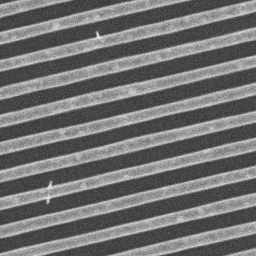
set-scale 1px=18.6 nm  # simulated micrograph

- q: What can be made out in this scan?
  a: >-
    parallel lines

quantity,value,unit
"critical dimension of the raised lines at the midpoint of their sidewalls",202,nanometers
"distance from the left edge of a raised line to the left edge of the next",501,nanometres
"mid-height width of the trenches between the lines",0.301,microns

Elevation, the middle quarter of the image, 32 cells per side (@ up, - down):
-------@@@@@@@@@@@@-------------
---@@@@@@@@@@@@@----------------
@@@@@@@@@@-------------------@@@
@@@@@@------------------@@@@@@@@
@@@-----------------@@@@@@@@@@@@
---------------@@@@@@@@@@@@-----
-----------@@@@@@@@@@@@@--------
------@@@@@@@@@@@@@-------------
--@@@@@@@@@@@@@-----------------
@@@@@@@@@@------------------@@@@
@@@@@@------------------@@@@@@@@
@-------------------@@@@@@@@@@@-
----------------@@@@@@@@@@@-----
-----------@@@@@@@@@@@@---------
-------@@@@@@@@@@@@-------------
---@@@@@@@@@@@------------------
@@@@@@@@@@@----------------@@@@@
@@@@@@@----------------@@@@@@@@@
@@-----------------@@@@@@@@@@@@-
--------------@@@@@@@@@@@@@-----
----------@@@@@@@@@@@@@---------
------@@@@@@@@@@@@--------------
---@@@@@@@@@@@------------------
@@@@@@@@@@-----------------@@@@@
@@@@@@------------------@@@@@@@@
@@-----------------@@@@@@@@@@@--
--------------@@@@@@@@@@@@------
----------@@@@@@@@@@@@----------
-------@@@@@@@@@@---------------
--@@@@@@@@@@@------------------@
@@@@@@@@@------------------@@@@@
@@@@------------------@@@@@@@@@@